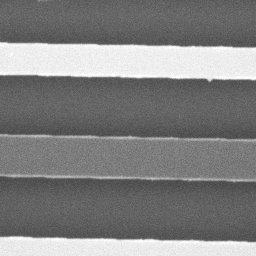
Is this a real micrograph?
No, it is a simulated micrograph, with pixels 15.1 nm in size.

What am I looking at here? lines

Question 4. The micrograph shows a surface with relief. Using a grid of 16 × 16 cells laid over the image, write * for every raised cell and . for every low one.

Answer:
................
................
................
****************
****************
................
................
................
***.............
****************
****************
................
................
................
................
****************